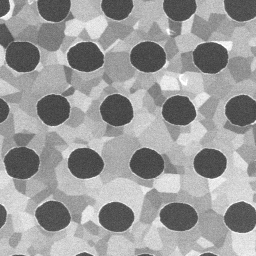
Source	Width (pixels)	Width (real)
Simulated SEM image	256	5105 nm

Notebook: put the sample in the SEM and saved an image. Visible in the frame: a regular array of holes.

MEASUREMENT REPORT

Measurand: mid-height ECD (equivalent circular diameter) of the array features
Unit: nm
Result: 670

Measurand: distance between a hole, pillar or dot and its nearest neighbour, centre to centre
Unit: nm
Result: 1230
